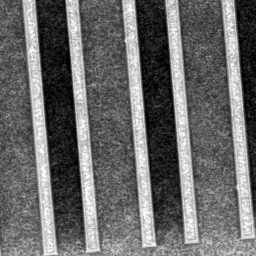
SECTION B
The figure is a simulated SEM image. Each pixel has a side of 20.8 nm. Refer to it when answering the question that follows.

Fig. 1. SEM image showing parallel lines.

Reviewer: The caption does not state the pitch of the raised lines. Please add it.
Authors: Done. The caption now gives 1030 nm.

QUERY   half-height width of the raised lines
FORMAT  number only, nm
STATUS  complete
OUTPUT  252